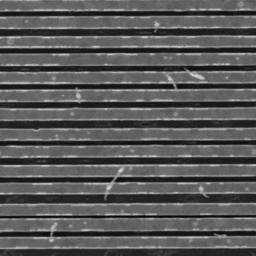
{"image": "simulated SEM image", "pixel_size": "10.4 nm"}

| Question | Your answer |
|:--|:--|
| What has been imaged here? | parallel lines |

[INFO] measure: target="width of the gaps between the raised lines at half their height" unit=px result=6.74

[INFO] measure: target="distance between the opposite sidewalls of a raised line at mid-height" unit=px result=11.9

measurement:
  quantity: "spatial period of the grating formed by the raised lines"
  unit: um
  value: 0.191